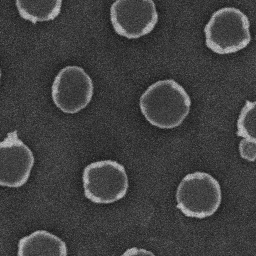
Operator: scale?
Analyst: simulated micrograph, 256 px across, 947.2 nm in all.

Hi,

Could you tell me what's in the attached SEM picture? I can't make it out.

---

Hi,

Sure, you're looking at raised bodies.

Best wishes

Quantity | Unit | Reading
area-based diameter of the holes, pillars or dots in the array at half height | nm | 165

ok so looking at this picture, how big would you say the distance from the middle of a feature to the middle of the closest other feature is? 350 nm